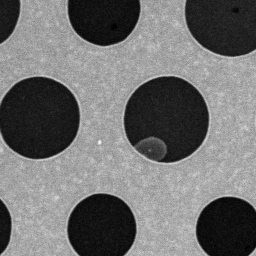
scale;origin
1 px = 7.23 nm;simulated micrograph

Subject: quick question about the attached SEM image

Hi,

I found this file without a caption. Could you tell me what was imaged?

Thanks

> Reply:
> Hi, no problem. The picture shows holes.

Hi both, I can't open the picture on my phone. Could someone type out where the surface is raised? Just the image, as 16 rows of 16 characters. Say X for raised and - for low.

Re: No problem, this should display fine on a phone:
-XXX-----XXX----
-XXX-----XXX----
XXXXX---XXXX----
XXXXXXXXXXXXXX-X
XXXXXXXXXXXXXXXX
X---XXXXX---XXXX
-----XXX-----XXX
-----XXX-----XXX
-----XXX-----XXX
X---XXXXX---XXXX
XXXXXXXXXXXXXXXX
XXXXXXXXXXXXXXXX
XXXXX---XXXXX--X
-XXX----XXXX----
-XXX-----XXX----
XXXXX---XXXXX---